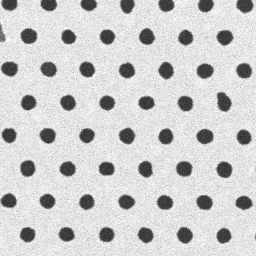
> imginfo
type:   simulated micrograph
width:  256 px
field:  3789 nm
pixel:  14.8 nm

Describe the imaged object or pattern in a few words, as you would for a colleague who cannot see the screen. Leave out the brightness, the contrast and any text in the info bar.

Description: a regular array of holes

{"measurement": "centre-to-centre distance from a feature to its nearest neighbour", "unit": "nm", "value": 562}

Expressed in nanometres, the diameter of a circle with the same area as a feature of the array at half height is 238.